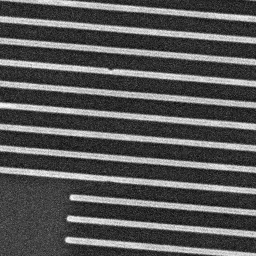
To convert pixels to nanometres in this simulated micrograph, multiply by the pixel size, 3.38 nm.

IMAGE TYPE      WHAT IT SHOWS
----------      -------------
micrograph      parallel lines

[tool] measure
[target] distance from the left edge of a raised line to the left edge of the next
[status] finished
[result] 0.0724 um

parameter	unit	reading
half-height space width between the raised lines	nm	54.7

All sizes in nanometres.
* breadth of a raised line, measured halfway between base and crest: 16